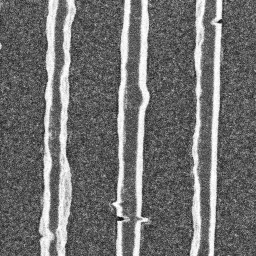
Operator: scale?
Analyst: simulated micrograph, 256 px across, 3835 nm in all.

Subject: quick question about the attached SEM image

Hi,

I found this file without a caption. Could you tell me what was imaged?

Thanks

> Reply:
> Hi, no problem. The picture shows one or a few lines or trenches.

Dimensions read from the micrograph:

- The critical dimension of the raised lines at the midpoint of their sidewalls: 284 nanometres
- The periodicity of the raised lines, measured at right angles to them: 1120 nanometers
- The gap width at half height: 0.827 micrometres